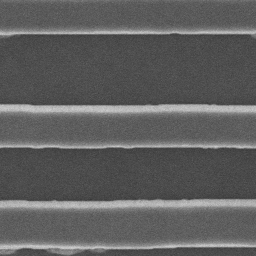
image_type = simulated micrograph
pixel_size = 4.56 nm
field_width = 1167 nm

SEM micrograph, lines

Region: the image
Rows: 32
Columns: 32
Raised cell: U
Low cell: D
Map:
UUUUUUUUUUUUUUUUUUUUUUUUUUUUUUUU
UUUUUUUUUUUUUUUUUUUUUUUUUUUUUUUU
UUUUUUUUUUUUUUUUUUUUUUUUUUUUUUUU
UUUUUUUUUUUUUUUUUUUUUUUUUUUUUUUU
DDDDDDDDDDDDDDDDDDDDDDDDDDDDDDDD
DDDDDDDDDDDDDDDDDDDDDDDDDDDDDDDD
DDDDDDDDDDDDDDDDDDDDDDDDDDDDDDDD
DDDDDDDDDDDDDDDDDDDDDDDDDDDDDDDD
DDDDDDDDDDDDDDDDDDDDDDDDDDDDDDDD
DDDDDDDDDDDDDDDDDDDDDDDDDDDDDDDD
DDDDDDDDDDDDDDDDDDDDDDDDDDDDDDDD
DDDDDDDDDDDDDDDDDDDDDDDDDDDDDDDD
DDDDDDDDDDDDDDDDDDDDDDDDDDDDDDDD
UUUUUUUUUUUUUUUUUUUUUUUUUUUUUUUU
UUUUUUUUUUUUUUUUUUUUUUUUUUUUUUUU
UUUUUUUUUUUUUUUUUUUUUUUUUUUUUUUU
UUUUUUUUUUUUUUUUUUUUUUUUUUUUUUUU
UUUUUUUUUUUUUUUUUUUUUUUUUUUUUUUU
DDDDDDDDDDDDDDDDDDDDDDDDDDDDDDDD
DDDDDDDDDDDDDDDDDDDDDDDDDDDDDDDD
DDDDDDDDDDDDDDDDDDDDDDDDDDDDDDDD
DDDDDDDDDDDDDDDDDDDDDDDDDDDDDDDD
DDDDDDDDDDDDDDDDDDDDDDDDDDDDDDDD
DDDDDDDDDDDDDDDDDDDDDDDDDDDDDDDD
DDDDDDDDDDDDDDDDDDDDDDDDDDDDDDDD
UUUUUUUUUUUUUUUUUUUUUUUUUUUUUUUU
UUUUUUUUUUUUUUUUUUUUUUUUUUUUUUUU
UUUUUUUUUUUUUUUUUUUUUUUUUUUUUUUU
UUUUUUUUUUUUUUUUUUUUUUUUUUUUUUUU
UUUUUUUUUUUUUUUUUUUUUUUUUUUUUUUU
UUUUUUUUUUUUUUUUUUUUUUUUUUUUUUUU
DDDDDDDDDDDDDDDDDDDDDDDDDDDDDDDD